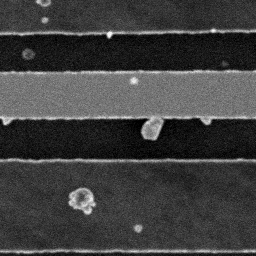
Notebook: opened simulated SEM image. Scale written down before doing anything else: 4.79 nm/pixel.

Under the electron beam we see lines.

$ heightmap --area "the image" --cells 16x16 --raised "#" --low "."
################
################
................
................
##..############
################
################
#........#..#...
.........#......
................
################
################
################
################
################
################